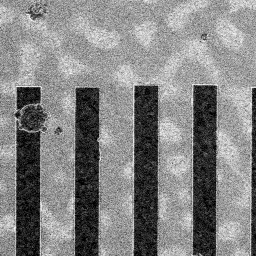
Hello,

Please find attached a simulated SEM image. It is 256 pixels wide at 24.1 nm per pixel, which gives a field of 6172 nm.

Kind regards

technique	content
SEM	parallel lines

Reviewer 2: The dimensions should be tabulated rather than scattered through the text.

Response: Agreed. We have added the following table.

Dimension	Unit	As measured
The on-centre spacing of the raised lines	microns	1.41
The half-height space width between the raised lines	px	33.9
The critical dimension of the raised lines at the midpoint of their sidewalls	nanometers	600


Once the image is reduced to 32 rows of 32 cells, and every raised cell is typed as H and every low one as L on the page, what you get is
LLLLHLLLLLLLLLLLLLLLLLLLLLLLLLLL
LLLLHHLLLLLLLLLLLLLLLLLLLLLLLLLL
LLLLLLLLLLLLLLLLLLLLLLLLLLLLLLLL
LLLLLLLLLLLLLLLLLLLLLLLLLLLLLLLL
LLLLLLLLLLLLLLLLLLLLLLLLLLLLLLLL
LLLLLLLLLLLLLLLLLLLLLLLLLLLLLLLL
LLLLLLLLLLLLLLLLLLLLLLLLLLLLLLLL
LLLLLLLLLLLLLLLLLLLLLLLLLLLLLLLL
LLLLLLLLLLLLLLLHLLLLLLLLLLLLLLLL
LLLLLLLLLLLLLLLHLLLLLLLLLLLLLLLL
LLLLLLLLLLLLLLLLLLLLLLLLLLLLLLLL
LLHHHLLLLHHHLLLLLHHHLLLLHHHLLLLH
LLHHHLLLLHHHLLLLLHHHLLLLHHHLLLLH
LLHHHLLLLHHHLLLLLHHHLLLLHHHLLLLH
LLHHHHLLLHHHLLLLLHHHLLLLHHHLLLLH
LLHHHHLLLHHHLLLLLHHHLLLLHHHLLLLH
LLHHHHLLLHHHLLLLLHHHLLLLHHHLLLLH
LLHHHLLLLHHHLLLLLHHHLLLLHHHHLLLH
LLHHHLLLLHHHLLLLLHHHLLLLHHHLLLLH
LLHHHLLLLHHHHLLLLHHHLLLLHHHLLLLH
LLHHHLLLLHHHLLLLLHHHLLLLHHHLLLLH
LLHHHLLLLHHHLLLLLHHHLLLLHHHLLLLH
LLHHHLLLLHHHLLLLLHHHLLLLHHHLLLLH
LLHHHLLLLHHHLLLLLHHHLLLLHHHLLLLH
LLHHHLLLLHHHLLLLLHHHLLLLHHHLLLLH
LLHHHLLLLHHHLLLLHHHHLLLLHHHLLLLH
LLHHHLLLLHHHHLLLHHHHLLLLHHHLLLLH
LHHHHLLLLHHHHLLLLHHHLLLLHHHLLLLH
LLHHHLLLLHHHLLLLLHHHLLLLHHHLLLLH
LLHHHLLLLHHHLLLLLHHHLLLLHHHLLLLH
LLHHHLLLLHHHLLLLLHHHLLLLHHHLLLLH
LLHHHLLLLHHHLLLLLHHHLLLLHHHLLLLH